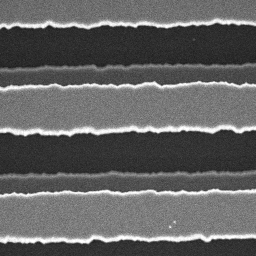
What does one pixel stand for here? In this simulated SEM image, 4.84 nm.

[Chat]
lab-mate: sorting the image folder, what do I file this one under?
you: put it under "lines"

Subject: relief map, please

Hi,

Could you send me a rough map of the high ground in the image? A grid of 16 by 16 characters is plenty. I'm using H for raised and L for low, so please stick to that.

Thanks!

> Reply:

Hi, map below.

HHHHHHHHHHHHHHHH
HHHHHHHHHHHHHLHH
LLLLLLLLLLLLLLLL
LLLLLLLLLLLLLLLL
HHHHHHHHHHHHHHHH
HHHHHHHHHHHHHHHH
HHHHHHHHHHHHHHHH
HHHHHHHHHHHHHHHH
LLLLLLLLLLLLLLLL
LLLLLLLLLLLLLLLL
LLLLLLLLLLLLLLLL
HHHHHHHHHHHHHHHH
HHHHHHHHHHHHHHHH
HHHHHHHHHHHHHHHH
HHHHHHHHHHHHHHHH
LLLLLLLLLLLLLLLL